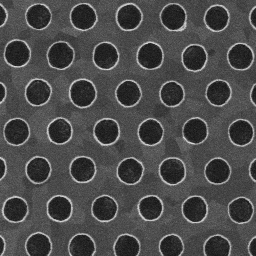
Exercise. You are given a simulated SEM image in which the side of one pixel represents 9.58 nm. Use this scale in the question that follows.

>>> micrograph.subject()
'a regular array of holes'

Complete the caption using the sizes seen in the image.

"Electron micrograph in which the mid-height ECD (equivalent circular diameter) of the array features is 245 nanometres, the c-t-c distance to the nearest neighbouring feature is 418 nanometers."